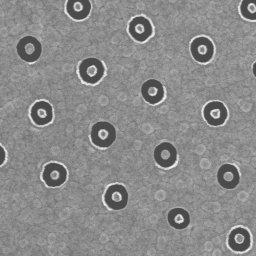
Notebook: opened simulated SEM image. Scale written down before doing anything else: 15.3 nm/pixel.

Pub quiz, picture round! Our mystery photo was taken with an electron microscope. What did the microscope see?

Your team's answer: a regular array of ring-shaped grooves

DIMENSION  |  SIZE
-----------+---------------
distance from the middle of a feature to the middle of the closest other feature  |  986 nm